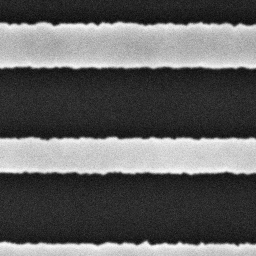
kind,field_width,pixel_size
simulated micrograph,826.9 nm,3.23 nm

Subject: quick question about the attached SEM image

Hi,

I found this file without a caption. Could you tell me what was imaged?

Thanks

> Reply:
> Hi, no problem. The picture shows lines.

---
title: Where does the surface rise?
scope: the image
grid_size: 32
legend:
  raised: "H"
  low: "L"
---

LLLLLLLLLLLLLLLLLLLLLLLLLLLLLLLL
LLLLLLLLLLLLLLLLLLLLLLLLLLLLLLLL
LLLLLLLLLLLLLLLLLLLLLLLLLLLLLLLL
HHHHHHHHHHHHHHHHHHHHHHHHHHHHHHHH
HHHHHHHHHHHHHHHHHHHHHHHHHHHHHHHH
HHHHHHHHHHHHHHHHHHHHHHHHHHHHHHHH
HHHHHHHHHHHHHHHHHHHHHHHHHHHHHHHH
HHHHHHHHHHHHHHHHHHHHHHHHHHHHHHHH
LLLLLLLLLHLLLLLLLLLLLLLLLLHHLLLH
LLLLLLLLLLLLLLLLLLLLLLLLLLLLLLLL
LLLLLLLLLLLLLLLLLLLLLLLLLLLLLLLL
LLLLLLLLLLLLLLLLLLLLLLLLLLLLLLLL
LLLLLLLLLLLLLLLLLLLLLLLLLLLLLLLL
LLLLLLLLLLLLLLLLLLLLLLLLLLLLLLLL
LLLLLLLLLLLLLLLLLLLLLLLLLLLLLLLL
LLLLLLLLLLLLLLLLLLLLLLLLLLLLLLLL
LLLLLLLLLLLLLLLLLLLLLLLLLLLLLLLL
HHHHHLHHHHHHHHHHHHHHHHHHLHHHHHHH
HHHHHHHHHHHHHHHHHHHHHHHHHHHHHHHH
HHHHHHHHHHHHHHHHHHHHHHHHHHHHHHHH
HHHHHHHHHHHHHHHHHHHHHHHHHHHHHHHH
HHHHHHHHHHHHHHHHHHHHHHHHHHHHLHHH
LLLLLLLLLLLLLLLLLLLLLLLLLLLLLLLL
LLLLLLLLLLLLLLLLLLLLLLLLLLLLLLLL
LLLLLLLLLLLLLLLLLLLLLLLLLLLLLLLL
LLLLLLLLLLLLLLLLLLLLLLLLLLLLLLLL
LLLLLLLLLLLLLLLLLLLLLLLLLLLLLLLL
LLLLLLLLLLLLLLLLLLLLLLLLLLLLLLLL
LLLLLLLLLLLLLLLLLLLLLLLLLLLLLLLL
LLLLLLLLLLLLLLLLLLLLLLLLLLLLLLLL
HHLHLHHHHHHHLHHHHLHLHLHLLHHHHLHL
HHHHHHHHHHHHHHHHHHHHHHHHHHHHHHHH